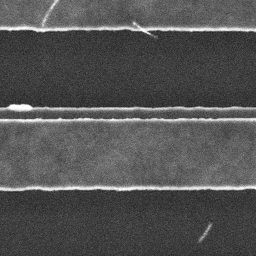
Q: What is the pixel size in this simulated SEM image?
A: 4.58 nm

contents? lines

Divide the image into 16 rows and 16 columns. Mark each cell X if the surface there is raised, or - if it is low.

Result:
XXXXXXXXXXXXXXXX
XXXXXXXXXXXXXXXX
----------------
----------------
----------------
----------------
----------------
XXXXXXXXXXXXXXXX
XXXXXXXXXXXXXXXX
XXXXXXXXXXXXXXXX
XXXXXXXXXXXXXXXX
XXXXXXXXXXXXXXXX
----------------
----------------
----------------
----------------